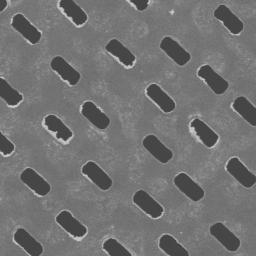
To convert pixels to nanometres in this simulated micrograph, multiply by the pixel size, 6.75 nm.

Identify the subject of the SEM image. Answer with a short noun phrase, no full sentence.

a regular array of holes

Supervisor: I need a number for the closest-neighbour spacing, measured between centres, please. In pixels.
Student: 49.8